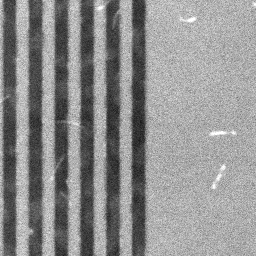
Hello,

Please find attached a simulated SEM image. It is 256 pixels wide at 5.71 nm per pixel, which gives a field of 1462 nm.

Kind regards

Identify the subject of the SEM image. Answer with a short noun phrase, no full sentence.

parallel lines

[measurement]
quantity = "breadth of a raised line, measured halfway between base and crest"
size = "87.7 nanometers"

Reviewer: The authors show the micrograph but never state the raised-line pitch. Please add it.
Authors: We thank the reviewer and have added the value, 0.147 µm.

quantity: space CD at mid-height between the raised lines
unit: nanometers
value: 61.4